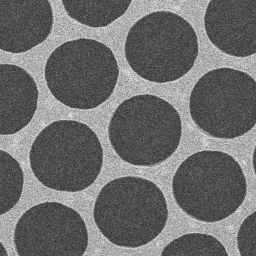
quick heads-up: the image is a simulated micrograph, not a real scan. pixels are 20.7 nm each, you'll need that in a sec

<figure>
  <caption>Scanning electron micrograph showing holes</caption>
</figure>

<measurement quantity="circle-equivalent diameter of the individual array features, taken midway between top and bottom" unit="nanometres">1500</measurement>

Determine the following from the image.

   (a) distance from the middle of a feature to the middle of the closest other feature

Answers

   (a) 1710 nm